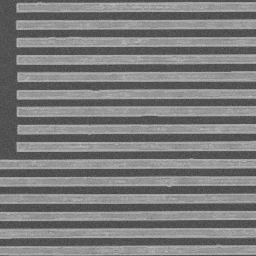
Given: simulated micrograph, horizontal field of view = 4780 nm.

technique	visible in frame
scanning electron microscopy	parallel lines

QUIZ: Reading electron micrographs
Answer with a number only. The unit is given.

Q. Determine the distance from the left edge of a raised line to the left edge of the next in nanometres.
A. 324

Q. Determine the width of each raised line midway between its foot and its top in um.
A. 0.142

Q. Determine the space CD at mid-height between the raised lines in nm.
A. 184